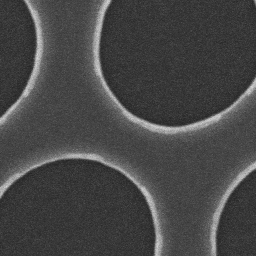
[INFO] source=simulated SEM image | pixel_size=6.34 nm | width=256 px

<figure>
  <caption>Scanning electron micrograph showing holes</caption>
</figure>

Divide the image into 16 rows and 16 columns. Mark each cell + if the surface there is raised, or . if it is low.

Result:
..+++++.........
..++++..........
..++++..........
..++++..........
..++++..........
..+++++.........
.++++++........+
+++++++++....+++
++++++++++++++++
++++++++++++++++
++.....+++++++++
+.......+++++++.
.........+++++..
..........++++..
..........+++...
..........+++...